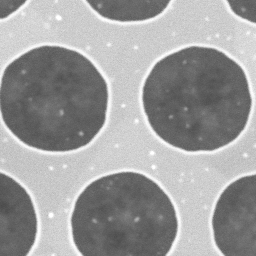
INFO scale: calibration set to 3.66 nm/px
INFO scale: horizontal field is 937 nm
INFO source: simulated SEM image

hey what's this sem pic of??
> holes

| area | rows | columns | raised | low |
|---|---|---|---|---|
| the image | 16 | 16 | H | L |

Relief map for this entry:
LHHHHHLLLLHHHHLL
HHHHHHHHHHHHHHHH
HHHHHHHHHHHHHHHH
HLLLLHHHHHLLLLHH
LLLLLLHHHLLLLLLH
LLLLLLLHHLLLLLLL
LLLLLLLHHLLLLLLL
LLLLLLLHHLLLLLLL
HLLLLLHHHHLLLLLH
HHHLHHHHHHHHHHHH
HHHHHHHHHHHHHHHH
LHHHHHLLLLHHHHLL
LLHHHLLLLLLHHHLL
LLHHLLLLLLLHHLLL
LLHHLLLLLLLHHLLL
LLHHHLLLLLLHHHLL